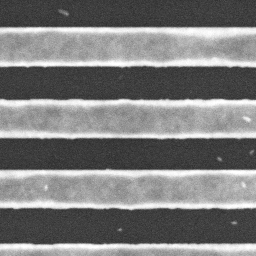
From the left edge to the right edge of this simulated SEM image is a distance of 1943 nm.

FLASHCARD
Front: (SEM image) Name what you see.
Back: lines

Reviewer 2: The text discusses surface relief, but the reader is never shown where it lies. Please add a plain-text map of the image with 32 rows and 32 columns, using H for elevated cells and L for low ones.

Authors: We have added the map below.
LLLLLLLLLLLLLLLLLLLLLLLLLLLLLLLL
LLLLLLLLLLLLLLLLLLLLLLLLLLLLLLLL
LLLLLLLLLLLLLLLLLLLLLLLLLLLLLLLL
HHHHHHHHHHHHHHHHHHHHHHLLLLLLLHLH
HHHHHHHHHHHHHHHHHHHHHHHHHHHHHHHH
HHHHHHHHHHHHHHHHHHHHHHHHHHHHHHHH
HHHHHHHHHHHHHHHHHHHHHHHHHHHHHHHH
HHHHHHHHHHHHHHHHHHHHHHHHHHHHHHHH
LLLLLLLLLLLLLLLLLLLLLLLLLLLLLLLL
LLLLLLLLLLLLLLLLLLLLLLLLLLLLLLLL
LLLLLLLLLLLLLLLLLLLLLLLLLLLLLLLL
LLLLLLLLLLLLLLLLLLLLLLLLLLLLLLLL
HLLLLHLLLLLLLLHHHLLLLLLLLLHHLLLL
HHHHHHHHHHHHHHHHHHHHHHHHHHHHHHHH
HHHHHHHHHHHHHHHHHHHHHHHHHHHHHHHH
HHHHHHHHHHHHHHHHHHHHHHHHHHHHHHHH
HHHHHHHHHHHHHHHHHHHHHHHHHHHHHHHH
LLLLLLLLLLLLLLLLLLLLLLLLLLLLLLLL
LLLLLLLLLLLLLLLLLLLLLLLLLLLLLLLL
LLLLLLLLLLLLLLLLLLLLLLLLLLLLLLLL
LLLLLLLLLLLLLLLLLLLLLLLLLLLLLLLL
HHHHHHHHHHHHHHHHHHHHHHHHHHHHHHHH
HHHHHHHHHHHHHHHHHHHHHHHHHHHHHHHH
HHHHHHHHHHHHHHHHHHHHHHHHHHHHHHHH
HHHHHHHHHHHHHHHHHHHHHHHHHHHHHHHH
HHHHHHHHHHHHHHHHHHHHHHHHHHHHHHHH
LLLLLLLLLLLLLLLLLLLLLLLLLLLLLLLL
LLLLLLLLLLLLLLLLLLLLLLLLLLLLLLLL
LLLLLLLLLLLLLLLLLLLLLLLLLLLLLLLL
LLLLLLLLLLLLLLLLLLLLLLLLLLLLLLLL
LLLLLLLLLLLLLLLLLLLLLLLLLLLLLLLL
HHHHHHHHHHHHHHHHHHHHHHHHHHHHHHHH